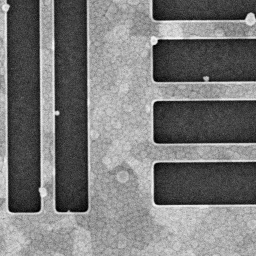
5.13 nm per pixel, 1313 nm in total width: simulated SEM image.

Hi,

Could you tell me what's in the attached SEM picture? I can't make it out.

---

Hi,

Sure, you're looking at groups of lines, slits or small figures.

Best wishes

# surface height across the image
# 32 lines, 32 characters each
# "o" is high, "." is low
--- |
o....oo....oooooooo.............
o....oo....oooooooo.............
o....oo....oooooooo...........oo
o....oo....ooooooooooooooooooooo
o....oo....ooooooooooooooooooooo
o....oo....oooooooo.............
o....oo....oooooooo.............
o....oo....oooooooo.............
o....oo....oooooooo.............
o....oo....oooooooo.............
o....oo....ooooooooooooooooooooo
o....oo....ooooooooooooooooooooo
o....oo....oooooooooooo.........
o....oo....oooooooo.............
o....oo....oooooooo.............
o....oo....oooooooo.............
o....oo....oooooooo.............
o....oo....oooooooo.............
o....oo....ooooooooooooooooooooo
o....oo....ooooooooooooooooooooo
o....oo....oooooooo.............
o....oo....oooooooo.............
o....oo....oooooooo.............
o....oo....oooooooo.............
o....oo....oooooooo.............
o....oo....ooooooooo............
o....oo....ooooooooooooooooooooo
oooooooooooooooooooooooooooooooo
oooooooooooooooooooooooooooooooo
oooooooooooooooooooooooooooooooo
oooooooooooooooooooooooooooooooo
oooooooooooooooooooooooooooooooo